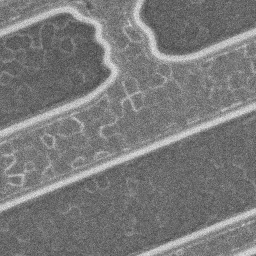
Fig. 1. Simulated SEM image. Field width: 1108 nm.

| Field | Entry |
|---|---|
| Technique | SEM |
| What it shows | one or a few lines or trenches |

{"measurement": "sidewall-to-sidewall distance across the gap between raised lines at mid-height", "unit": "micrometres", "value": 0.418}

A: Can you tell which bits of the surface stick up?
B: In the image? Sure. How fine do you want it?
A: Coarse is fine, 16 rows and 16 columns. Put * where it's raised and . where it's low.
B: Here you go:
*********.......
**....***.......
......****.....*
.......***..****
.......*********
......**********
.....***********
..************..
***********.....
*********.......
******..........
****............
*...............
...............*
.............***
..........******